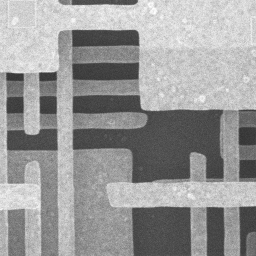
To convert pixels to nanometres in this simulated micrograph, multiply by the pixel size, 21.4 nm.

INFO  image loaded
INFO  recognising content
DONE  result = wiring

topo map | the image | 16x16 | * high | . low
****************
****************
****.....*******
****.....*******
**.......*******
.........*******
.........*******
................
................
................
................
.......*********
**.....*********
................
................
................